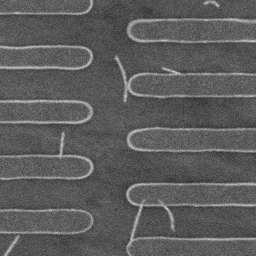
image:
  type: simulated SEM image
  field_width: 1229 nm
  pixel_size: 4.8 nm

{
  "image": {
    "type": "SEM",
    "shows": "groups of lines, slits or small figures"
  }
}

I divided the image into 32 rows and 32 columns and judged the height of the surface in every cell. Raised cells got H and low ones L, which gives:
HHHHHHHHHHHLLLLLLLLLLLLLLLLLLLLL
HHHHHHHHHHHLLLLLLLLLLLLLLLLLLLLL
LLLLLLLLLLLLLLLLLLLHHHHHHHHHHHLL
LLLLLLLLLLLLLLLLHHHHHHHHHHHHHHHH
LLLLLLLLLLLLLLLLHHHHHHHHHHHHHHHH
LLLLLLLLLLLLLLLLLLLLLLLLLLLLLLLL
HHHHHHHHHHHLLLLLLLLLLLLLLLLLLLLL
HHHHHHHHHHHLLLLLLLLLLLLLLLLLLLLL
LLLLLLLHHHLLLLLLLLLLLLLLLLLLLLLL
LLLLLLLLLLLLLLLLLHHHHHHHHHHHHHHH
LLLLLLLLLLLLLLLLHHHHHHHHHHHHHHHH
LLLLLLLLLLLLLLLLHHHHHHHHHHHHHHHH
LLLLLLLLLLLLLLLLLLLLLLLLLLLLLLLL
HHHHHHHHHHHLLLLLLLLLLLLLLLLLLLLL
HHHHHHHHHHHLLLLLLLLLLLLLLLLLLLLL
LLLLLLLLLLLLLLLLLLLLLLLLLLLLLLLL
LLLLLLLLLLLLLLLLLHHHHHHHHHHHHHHH
LLLLLLLLLLLLLLLLHHHHHHHHHHHHHHHH
LLLLLLLLLLLLLLLLLHHHHHHHHHHHHHHH
LLHHHHHHHHLLLLLLLLLLLLLLLLLLLLLL
HHHHHHHHHHHLLLLLLLLLLLLLLLLLLLLL
HHHHHHHHHHHLLLLLLLLLLLLLLLLLLLLL
LLLLLLLLLLLLLLLLLLLLLLLLLLLLLLLL
LLLLLLLLLLLLLLLLHHHHHHHHHHHHHHHH
LLLLLLLLLLLLLLLLHHHHHHHHHHHHHHHH
LLLLLLLLLLLLLLLLLHHHHHHHHHHHHHHH
HHHHHHHHHHHLLLLLLLLLLLLLLLLLLLLL
HHHHHHHHHHHHLLLLLLLLLLLLLLLLLLLL
HHHHHHHHHHHLLLLLLLLLLLLLLLLLLLLL
LLLLLLLLLLLLLLLLLLLLLLLLLLLLLLLL
LLLLLLLLLLLLLLLLHHHHHHHHHHHHHHHH
LLLLLLLLLLLLLLLLHHHHHHHHHHHHHHHH